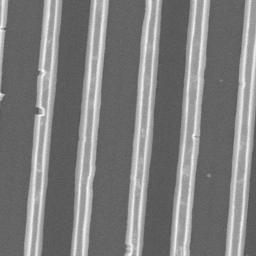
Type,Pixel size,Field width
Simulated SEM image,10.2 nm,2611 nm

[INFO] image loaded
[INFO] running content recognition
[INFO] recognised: parallel lines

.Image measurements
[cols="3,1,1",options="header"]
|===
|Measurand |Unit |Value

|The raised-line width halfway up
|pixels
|12.7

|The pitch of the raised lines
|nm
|509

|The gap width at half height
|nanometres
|408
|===